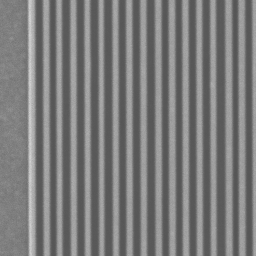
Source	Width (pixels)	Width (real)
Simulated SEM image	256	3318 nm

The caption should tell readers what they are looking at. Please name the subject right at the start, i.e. parallel lines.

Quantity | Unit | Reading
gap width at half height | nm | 97.2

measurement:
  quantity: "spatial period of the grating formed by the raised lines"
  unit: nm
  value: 181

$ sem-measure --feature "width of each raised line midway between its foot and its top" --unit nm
82.6